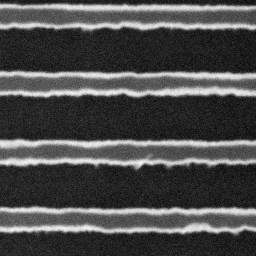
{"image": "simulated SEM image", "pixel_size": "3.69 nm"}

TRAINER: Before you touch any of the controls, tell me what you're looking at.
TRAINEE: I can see lines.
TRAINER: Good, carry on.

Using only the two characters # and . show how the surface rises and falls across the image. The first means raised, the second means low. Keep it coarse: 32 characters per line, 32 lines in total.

................................
################################
################################
...............................#
................................
................................
................................
................................
................................
################################
################################
#######################.##.#.###
................................
................................
................................
................................
................................
................................
################################
################################
...............#................
................................
................................
................................
................................
................................
################################
################################
################################
................................
................................
................................